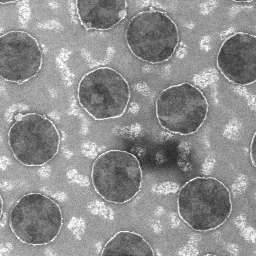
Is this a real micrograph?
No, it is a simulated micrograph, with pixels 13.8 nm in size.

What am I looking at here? raised bodies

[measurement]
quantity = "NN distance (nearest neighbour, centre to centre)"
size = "1.1 microns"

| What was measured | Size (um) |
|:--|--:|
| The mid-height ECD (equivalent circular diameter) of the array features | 0.713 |